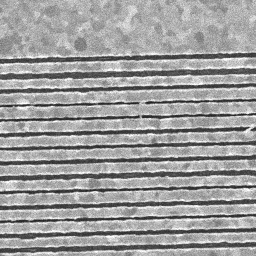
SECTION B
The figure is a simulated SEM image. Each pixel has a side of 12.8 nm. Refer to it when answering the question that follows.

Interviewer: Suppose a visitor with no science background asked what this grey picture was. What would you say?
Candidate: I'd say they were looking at parallel lines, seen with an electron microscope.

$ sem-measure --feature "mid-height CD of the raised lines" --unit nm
131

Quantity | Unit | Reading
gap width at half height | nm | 59.1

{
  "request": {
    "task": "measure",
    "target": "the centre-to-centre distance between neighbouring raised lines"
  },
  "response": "186 nanometres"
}